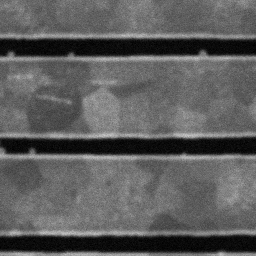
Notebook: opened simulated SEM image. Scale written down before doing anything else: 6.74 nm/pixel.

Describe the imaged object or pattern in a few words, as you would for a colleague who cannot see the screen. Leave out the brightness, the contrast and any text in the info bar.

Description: lines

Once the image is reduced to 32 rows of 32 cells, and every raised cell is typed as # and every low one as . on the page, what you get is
################################
################################
################################
################################
################################
................................
................................
################################
################################
################################
################################
################################
################################
################################
################################
################################
################################
................................
................................
###########.................###.
################################
################################
################################
################################
################################
################################
################################
################################
################################
................................
................................
................................